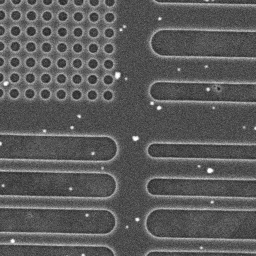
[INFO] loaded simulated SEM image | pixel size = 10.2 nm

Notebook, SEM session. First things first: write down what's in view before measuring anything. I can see groups of lines, slits or small figures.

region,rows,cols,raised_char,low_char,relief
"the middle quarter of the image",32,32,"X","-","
XX--XX--XX--XXXXXXXXXXXXXXXXXXXX
XXXXXXXXXXXXXXXXXXXXXXXXXXXXXXXX
XXXXXXXXXXXXXXXXXXXXXXXXXXXXXXXX
-X--XX--XX--XXXXXXXXXXXXXXXXXXXX
XX--XX--XX--XXXXXXXXXXX-------XX
XXXXXXXXXXXXXXXXXXXXXX----------
XXX-XXXXXXXXXXXXXXXXX-----------
XX--XX--XX--XXXXXXXXXX----------
XX--XX--XX--XXXXXXXXXX----------
XXXXXXXXXXXXXXXXXXXXXXXXXXXXXXXX
XXXXXXXXXXXXXXXXXXXXXXXXXXXXXXXX
XXXXXXXXXXXXXXXXXXXXXXXXXXXXXXXX
XXXXXXXXXXXXXXXXXXXXXXXXXXXXXXXX
XXXXXXXXXXXXXXXXXXXXXXXXXXXXXXXX
XXXXXXXXXXXXXXXXXXXXXXXXXXXXXXXX
XXXXXXXXXXXXXXXXXXXXXXXXXXXXXXXX
XXXXXXXXXXXXXXXXXXXXXXXXXXXXXXXX
XXXXXXXXXXXXXXXXXXXXXXXXXXXXXXXX
------------XXXXXXXXXXXXXXXXXXXX
-------------XXXXXXXXXXXXXXXXXXX
-------------XXXXXXXX-----------
-------------XXXXXXXX-----------
-------------XXXXXXXX-----------
------------XXXXXXXXXXX---------
XXXXXXXXXXXXXXXXXXXXXXXXXXXXXXXX
XXXXXXXXXXXXXXXXXXXXXXXXXXXXXXXX
XXXXXXXXXXXXXXXXXXXXXXXXXXXXXXXX
-----------XXXXXXXXXXXXXXXXXXXXX
------------XXXXXXXXXXX-----XXXX
-------------XXXXXXXX-----------
-------------XXXXXXXX-----------
-------------XXXXXXXX-----------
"